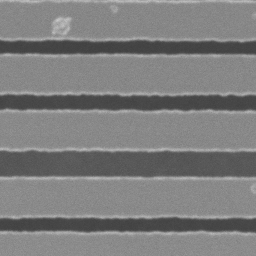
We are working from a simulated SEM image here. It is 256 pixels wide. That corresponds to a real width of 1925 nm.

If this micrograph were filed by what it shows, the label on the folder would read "lines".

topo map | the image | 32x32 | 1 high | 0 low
11111111111111111111111111111111
11111111111111111111111111111111
11111111111111111111111111111111
11111111111111111111111111111111
11111111111111111111111111111111
00000000000000000000000000000000
00000000000000000000000000000000
11111111111111111111111111111111
11111111111111111111111111111111
11111111111111111111111111111111
11111111111111111111111111111111
11111111111111111111111111111111
00000000000000000000000000000000
00000000000000000000000000000000
11111111111111111111111111111111
11111111111111111111111111111111
11111111111111111111111111111111
11111111111111111111111111111111
11111111111111111111111111111111
00000000000000000000000000000000
00000000000000000000000000000000
00000000000000000000000000000000
11111111111111111111111111111111
11111111111111111111111111111111
11111111111111111111111111111111
11111111111111111111111111111111
11111111111111111111111111111111
00000000000000000000000000000000
00000000000000000000000000000000
11111111111111111111111111111111
11111111111111111111111111111111
11111111111111111111111111111111